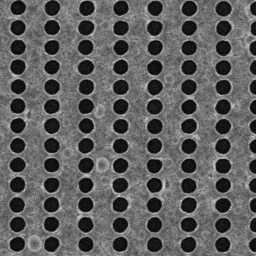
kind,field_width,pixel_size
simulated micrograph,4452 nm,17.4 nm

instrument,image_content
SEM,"a regular array of holes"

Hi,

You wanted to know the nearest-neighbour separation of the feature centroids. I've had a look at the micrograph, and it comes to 337 nm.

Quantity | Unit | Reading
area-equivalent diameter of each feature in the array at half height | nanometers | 270